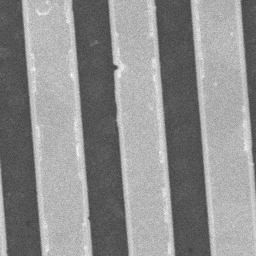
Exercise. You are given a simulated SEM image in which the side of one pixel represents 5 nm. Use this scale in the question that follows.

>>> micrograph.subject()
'one or a few lines or trenches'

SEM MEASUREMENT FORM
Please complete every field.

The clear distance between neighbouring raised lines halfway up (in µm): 0.203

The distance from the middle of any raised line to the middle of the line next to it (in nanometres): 420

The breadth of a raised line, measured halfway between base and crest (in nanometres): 224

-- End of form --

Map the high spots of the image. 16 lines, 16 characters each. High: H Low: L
LLHHLLLHHHLLHHHL
LLHHLLLHHHLLHHHL
LLHHHLLHHHLLHHHL
LLHHHLLHHHLLHHHL
LLHHHLLHHHLLHHHL
LLHHHLLHHHLLLHHL
LLHHHLLHHHLLLHHL
LLHHHLLHHHLLLHHL
LLHHHLLLHHLLLHHH
LLHHHLLLHHLLLHHH
LLHHHLLLHHLLLHHH
LLHHHLLLHHLLLHHH
LLHHHLLLHHHLLHHH
LLLHHLLLHHHLLHHH
LLLHHHLLHHHLLHHH
LLLHHHLLHHHLLHHH